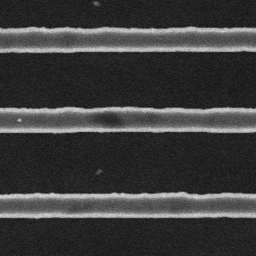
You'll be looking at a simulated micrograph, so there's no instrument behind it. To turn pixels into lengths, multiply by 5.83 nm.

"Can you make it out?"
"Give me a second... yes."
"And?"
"lines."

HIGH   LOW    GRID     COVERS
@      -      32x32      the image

--------------------------------
--------------------------------
--------------------------------
--------------------------------
@@@@@@@@@@@@@@@@@@@@@@@@@@@@@@@@
@@@@@@@@@@@@@@@@@@@@@@@@@@@@@@@@
--------------------------------
--------------------------------
--------------------------------
--------------------------------
--------------------------------
--------------------------------
--------------------------------
--------------------------------
@@@@@@@@@@@@@@@@@@@@@@@@@@@@@@@@
@@@@@@@@@@@@@@@@@@@@@@@@@@@@@@@@
------@@------------------------
--------------------------------
--------------------------------
--------------------------------
--------------------------------
--------------------------------
--------------------------------
--------------------------------
@@@@@@@@@@@@@@@@@@@@@@@@@@@@@@@@
@@@@@@@@@@@@@@@@@@@@@@@@@@@@@@@@
@@@@@@@@@@@@@@@@@@@@@@@@@@@@@@@@
--------------------------------
--------------------------------
--------------------------------
--------------------------------
--------------------------------